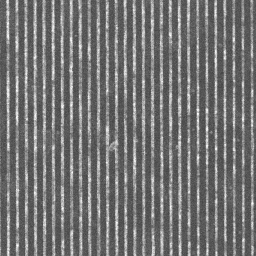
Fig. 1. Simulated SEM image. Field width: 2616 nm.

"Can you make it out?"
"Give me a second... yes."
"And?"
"parallel lines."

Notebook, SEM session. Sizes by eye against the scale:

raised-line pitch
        92.3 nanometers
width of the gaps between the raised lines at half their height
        67.7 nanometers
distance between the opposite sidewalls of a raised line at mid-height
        24.3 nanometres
